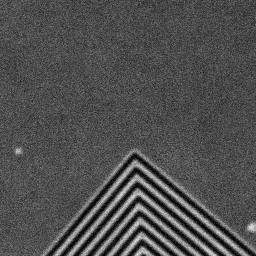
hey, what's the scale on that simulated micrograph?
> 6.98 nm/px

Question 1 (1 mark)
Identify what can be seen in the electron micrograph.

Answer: groups of lines, slits or small figures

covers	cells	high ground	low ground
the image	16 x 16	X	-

XXXXXXXXXXXXXXXX
XXXXXXXXXXXXXXXX
XXXXXXXXXXXXXXXX
XXXXXXXXXXXXXXXX
XXXXXXXXXXXXXXXX
XXXXXXXXXXXXXXXX
XXXXXXXXXXXXXXXX
XXXXXXXXXXXXXXXX
XXXXXXXXXXXXXXXX
XXXXXXXXXXXXXXXX
XXXXXXXX--XXXXXX
XXXXXXX----XXXXX
XXXXXX------XXXX
XXXXX--------XXX
XXXX----------XX
XXX------------X